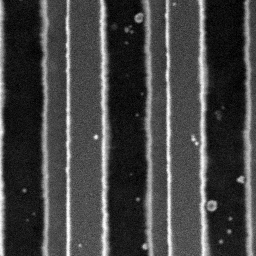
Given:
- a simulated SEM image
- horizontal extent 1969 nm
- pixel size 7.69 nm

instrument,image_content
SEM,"lines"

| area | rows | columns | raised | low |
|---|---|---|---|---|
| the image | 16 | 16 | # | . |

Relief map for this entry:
...###...####..#
...###...####..#
...###...####...
...####..####..#
...####..####...
...####..####...
...####..####...
...####..####...
...####..####...
...####..####...
...####..####...
...####..####...
...####..####...
...####..####...
...####..####...
...####..####...